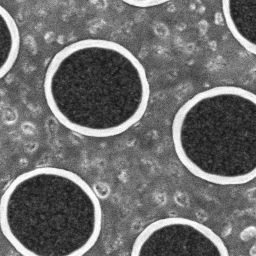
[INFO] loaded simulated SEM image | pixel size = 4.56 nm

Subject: raised bodies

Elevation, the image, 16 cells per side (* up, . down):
..............**
*.............**
*..............*
*...****........
...******.......
...******.......
...******...****
....****...*****
...........*****
...........*****
............****
.****...........
******..........
******..........
******...****...
.****....*****..